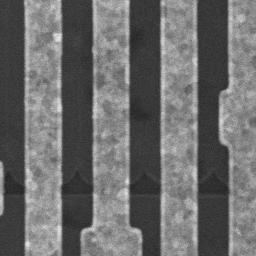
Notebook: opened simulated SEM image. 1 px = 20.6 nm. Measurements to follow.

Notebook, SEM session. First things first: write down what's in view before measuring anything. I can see wiring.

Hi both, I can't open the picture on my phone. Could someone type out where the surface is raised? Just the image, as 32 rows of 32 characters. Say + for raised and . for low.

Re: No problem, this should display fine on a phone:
...++++.....++++....++++.....+++
...++++.....++++....++++.....+++
...++++.....++++....++++.....+++
...++++.....++++....++++.....+++
...++++.....++++....++++.....+++
...++++.....++++....++++.....+++
...++++.....++++....++++.....+++
...++++.....++++....++++.....+++
...++++.....++++....++++.....+++
...++++.....++++....++++.....+++
...++++.....++++....++++.....+++
...++++.....++++....++++....++++
...++++.....++++....++++....++++
...++++.....++++....++++....++++
...++++.....++++....++++....++++
...++++.....++++....++++....++++
...++++.....++++....++++....++++
...++++.....++++....++++....++++
...++++.....++++....++++.....+++
...++++.....++++....++++.....+++
...++++.....++++....++++.....+++
...++++.....++++....++++.....+++
...++++.....++++....++++.....+++
...++++.....++++....++++.....+++
...++++.....++++....++++.....+++
...++++.....++++....++++.....+++
...++++.....++++....++++.....+++
...++++.....++++....++++.....+++
...++++.....++++....++++.....+++
...++++...+++++++...++++.....+++
...++++...+++++++...++++.....+++
...++++...+++++++...++++.....+++